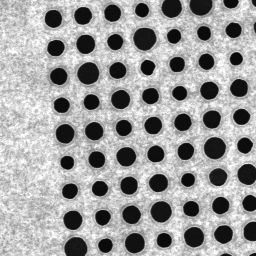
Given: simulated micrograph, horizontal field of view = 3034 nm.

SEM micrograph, a regular array of holes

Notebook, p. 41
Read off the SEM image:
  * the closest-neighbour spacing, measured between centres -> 340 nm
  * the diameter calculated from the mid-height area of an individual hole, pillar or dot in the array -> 204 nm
